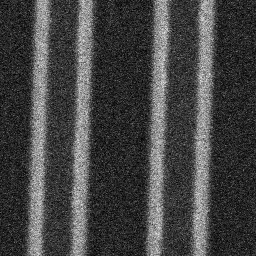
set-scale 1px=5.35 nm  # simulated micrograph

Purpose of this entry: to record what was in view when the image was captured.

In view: one or a few lines or trenches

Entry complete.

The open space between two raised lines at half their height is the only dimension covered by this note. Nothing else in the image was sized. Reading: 385 nm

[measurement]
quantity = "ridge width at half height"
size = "257 nanometres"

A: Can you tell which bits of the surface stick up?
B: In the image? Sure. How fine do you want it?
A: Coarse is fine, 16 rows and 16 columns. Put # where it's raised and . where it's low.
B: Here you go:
...##.....###...
...##.....###...
..###.....###...
..###.....###...
..###.....###...
..###.....###...
..###.....###...
..###.....###...
..###.....###...
..###.....###...
..###.....###...
..###.....###...
..###.....###...
..###.....###...
..###.....###...
..###.....###...